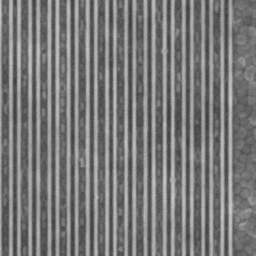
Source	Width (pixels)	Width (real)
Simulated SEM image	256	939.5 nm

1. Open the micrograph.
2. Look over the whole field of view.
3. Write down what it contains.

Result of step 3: parallel lines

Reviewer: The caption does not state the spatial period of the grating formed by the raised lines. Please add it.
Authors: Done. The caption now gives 0.035 um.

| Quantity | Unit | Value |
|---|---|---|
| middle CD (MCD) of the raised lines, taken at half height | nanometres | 9.6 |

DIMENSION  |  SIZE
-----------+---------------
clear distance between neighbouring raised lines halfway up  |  19.3 nm